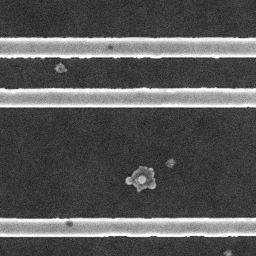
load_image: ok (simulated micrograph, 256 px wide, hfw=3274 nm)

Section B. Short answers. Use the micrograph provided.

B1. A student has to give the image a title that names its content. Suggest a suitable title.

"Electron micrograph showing lines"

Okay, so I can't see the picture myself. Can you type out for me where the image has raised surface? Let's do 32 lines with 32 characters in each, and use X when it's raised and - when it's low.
--------------------------------
--------------------------------
--------------------------------
--------------------------------
--------------------------------
XXXXXXXXXXXXXXXXXXXXXXXXXXXXXXXX
XXXXXXXXXXXXXXXXXXXXXXXXXXXXXXXX
--------------------------------
--------------------------------
--------------------------------
--------------------------------
XXXXXXXXXXXXXXXXXXXXXXXXXXXXXXXX
XXXXXXXXXXXXXXXXXXXXXXXXXXXXXXXX
--------------------------------
--------------------------------
--------------------------------
--------------------------------
--------------------------------
--------------------------------
--------------------------------
--------------------------------
--------------------------------
-----------------XX-------------
--------------------------------
--------------------------------
--------------------------------
--------------------------------
XXX---XXXXXXXXXXXXXXXXXXXXXXXXXX
XXXXXXXXXXXXXXXXXXXXXXXXXXXXXXXX
XXXXXXXXXXXXXX--XXXXXXXX-XXXX---
--------------------------------
--------------------------------